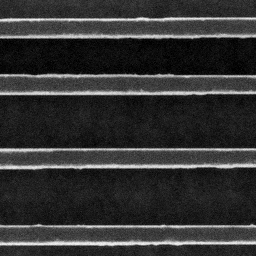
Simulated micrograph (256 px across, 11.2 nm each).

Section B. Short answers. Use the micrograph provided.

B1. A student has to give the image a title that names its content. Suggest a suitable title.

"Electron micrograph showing lines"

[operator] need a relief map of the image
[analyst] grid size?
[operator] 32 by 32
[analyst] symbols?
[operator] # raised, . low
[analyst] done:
................................
................................
################################
################################
################################
................................
................................
................................
................................
################################
################################
################################
................................
................................
................................
................................
................................
................................
................................
################################
################################
................................
................................
................................
................................
................................
................................
................................
################################
################################
###################...#.........
................................